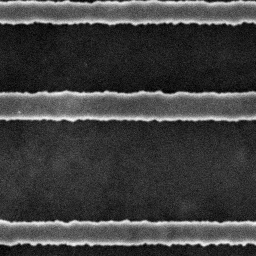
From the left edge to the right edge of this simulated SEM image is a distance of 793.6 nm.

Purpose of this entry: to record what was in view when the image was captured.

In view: lines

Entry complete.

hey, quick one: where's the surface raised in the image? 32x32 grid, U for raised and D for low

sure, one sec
UUUUUUUUUUUUUUUUUUUUUUUUUUUUUUUU
UUUUUUUUUUUUUUUUUUUUUUUUUUUUUUUU
UUUUUUUUUUUUUUUUUUUUUUUUUUUUUUUU
DDDDDDDDDDDDDDDDDDDDDDDDDDDDDDDD
DDDDDDDDDDDDDDDDDDDDDDDDDDDDDDDD
DDDDDDDDDDDDDDDDDDDDDDDDDDDDDDDD
DDDDDDDDDDDDDDDDDDDDDDDDDDDDDDDD
DDDDDDDDDDDDDDDDDDDDDDDDDDDDDDDD
DDDDDDDDDDDDDDDDDDDDDDDDDDDDDDDD
DDDDDDDDDDDDDDDDDDDDDDDDDDDDDDDD
DDDDDDDDDDDDDDDDDDDDDDDDDDDDDDDD
DDDDDDDDUDDDDUDDDUDDDDDDDDDDDDDD
UUUUUUUUUUUUUUUUUUUUUUUUUUUUUUUU
UUUUUUUUUUUUUUUUUUUUUUUUUUUUUUUU
UUUUUUUUUUUUUUUUUUUUUUUUUUUUUUUU
DDDDDDDDDDDDDDDDDDDDDDDDDDDDDDDD
DDDDDDDDDDDDDDDDDDDDDDDDDDDDDDDD
DDDDDDDDDDDDDDDDDDDDDDDDDDDDDDDD
DDDDDDDDDDDDDDDDDDDDDDDDDDDDDDDD
DDDDDDDDDDDDDDDDDDDDDDDDDDDDDDDD
DDDDDDDDDDDDDDDDDDDDDDDDDDDDDDDD
DDDDDDDDDDDDDDDDDDDDDDDDDDDDDDDD
DDDDDDDDDDDDDDDDDDDDDDDDDDDDDDDD
DDDDDDDDDDDDDDDDDDDDDDDDDDDDDDDD
DDDDDDDDDDDDDDDDDDDDDDDDDDDDDDDD
DDDDDDDDDDDDDDDDDDDDDDDDDDDDDDDD
DDDDDDDDDDDDDDDDDDDDDDDDDDDDDDDD
DDDDDDDDDDDDDDDDDDDDDDDDDDDDDDDD
UUUUUUUUUUUUUUUUUUUUUUUUUUUUUUUU
UUUUUUUUUUUUUUUUUUUUUUUUUUUUUUUU
UUDDDUDDDUDUUUUUUUDDDUDDDUDDDDUD
DDDDDDDDDDDDDDDDDDDDDDDDDDDDDDDD